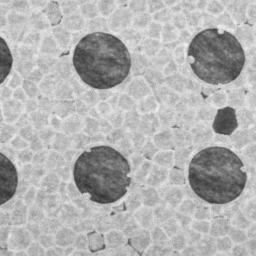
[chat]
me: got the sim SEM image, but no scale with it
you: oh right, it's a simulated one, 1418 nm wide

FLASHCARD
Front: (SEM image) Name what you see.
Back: holes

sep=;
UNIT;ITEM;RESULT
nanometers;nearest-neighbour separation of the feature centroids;634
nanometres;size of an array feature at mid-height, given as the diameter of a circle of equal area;316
